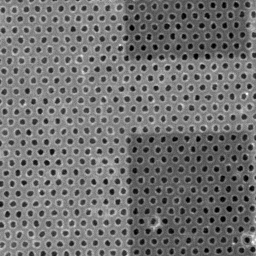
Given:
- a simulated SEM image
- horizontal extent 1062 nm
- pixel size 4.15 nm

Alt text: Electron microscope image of a regular array of holes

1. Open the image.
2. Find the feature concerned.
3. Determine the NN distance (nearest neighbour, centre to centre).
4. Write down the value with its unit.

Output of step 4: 46.5 nm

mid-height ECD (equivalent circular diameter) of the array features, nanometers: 24.8